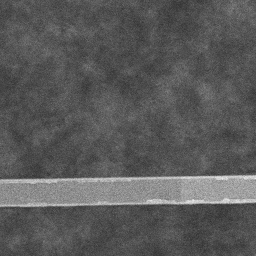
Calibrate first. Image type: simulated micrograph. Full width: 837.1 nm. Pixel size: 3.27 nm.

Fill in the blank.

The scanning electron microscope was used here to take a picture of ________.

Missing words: one or a few lines or trenches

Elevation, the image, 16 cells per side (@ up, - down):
----------------
----------------
----------------
----------------
----------------
----------------
----------------
----------------
----------------
----------------
----------------
@@@@@@@@@@@@@@@@
@@@@@@@@@@@@@@@@
----------------
----------------
----------------